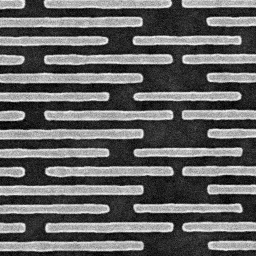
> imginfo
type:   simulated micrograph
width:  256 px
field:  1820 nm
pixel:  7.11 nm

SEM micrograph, wiring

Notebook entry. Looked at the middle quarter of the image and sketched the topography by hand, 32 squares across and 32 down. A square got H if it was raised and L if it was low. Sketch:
LLLLLLLLLLLLLLLLLLLLLLLLLLLLLLLL
LLLLLLLLLLLLLLLLLLLLLLLLLLLLLLLL
LLLLLLLLLLLHLLLLLLLLLLLLLLLLLLLL
HHHHHHHHHHHHHHHHHHHLLLLLLLLLLLLL
HHHHHHHHHHHHHHHHHHHLLLLLLLLLLLLL
LLLLLLLLLLLLLLLLLLLLLLLLLLLLLLLL
LLLLLLLLLLLLLLLLLLLLLLLLLLLLLLLL
HHHHHHHHHHHLLLLLLLHHHHHHHHHHHHHH
HHHHHHHHHHHLLLLLLHHHHHHHHHHHHHHH
LLLLLLLLLLLLLLLLLLLLLLLLLLLLLLLL
LLLLLLLLLLLLLLLLLLLLLLLLLLLLLLLL
LLLLLLLLLLLLLLLLLLLLLLLLLLLLLLLL
HHHHHHHHHHHHHHHHHHHHHHHHHHHLLLHH
HHHHHHHHHHHHHHHHHHHHHHHHHHHLLLHH
LLLLLLLLLLLLLLLLLLLLLLLLLLLLLLLL
LLLLLLLLLLLLLLLLLLLLLLLLLLLLLLLL
LLLLLLLLLLLLLLLLLLLLLLLLLLLLLLLL
HHHHHHHHHHHHHHHHHHHHLLLLLLLLLLLL
HHHHHHHHLLLHHHHHHHLLLLLLLLLLLLLL
LLLLLLLLLLLLLLLLLLLLLLLLLLLLLLLL
LLLLLLLLLLLLLLLLLLLLLLLLLLLLLLLL
HHHHHHHHHHHLLLLLLLLHHHHHHHHHHHHH
HHHHHHHHHHHLLLLLLLHHHHHHHHHHHHHH
LLLLLLLLLLLLLLLLLLLLLLLLLLLLLLLL
LLLLLLLLLLLLLLLLLLLLLLLLLLLLLLLL
LLLLLLLLLLLLLLLLLLLLLLLLLLLLLLLL
HHHHHHHHHHHHHHHHHHHHHHHHHHHLLLHH
HHHHHHHHHHHHHHHHHHHHHHHHHHHLLLHH
LLLLLLLLLLLLLLLLLLLLLLLLLLLLLLLL
LLLLLLLLLLLLLLLLLLLLLLLLLLLLLLLL
LLLLLLLLLLLLLLLLLLLLLLLLLLLLLLLL
HHHHHHHHHHHHHHHHHHHHLLLLLLLLLLLL